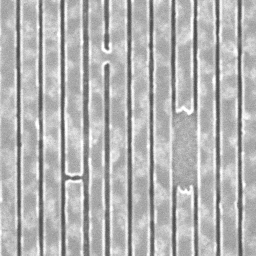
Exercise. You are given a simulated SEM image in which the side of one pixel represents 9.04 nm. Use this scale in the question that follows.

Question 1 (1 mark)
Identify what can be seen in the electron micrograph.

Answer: parallel lines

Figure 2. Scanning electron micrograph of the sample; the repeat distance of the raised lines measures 200 nm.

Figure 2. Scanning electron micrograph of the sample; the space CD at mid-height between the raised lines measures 41.8 nanometers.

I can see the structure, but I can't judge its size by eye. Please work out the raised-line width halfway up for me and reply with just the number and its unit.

151 nanometers